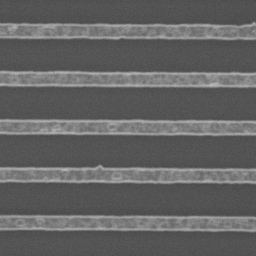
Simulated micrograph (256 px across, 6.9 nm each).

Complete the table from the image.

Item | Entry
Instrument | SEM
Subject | parallel lines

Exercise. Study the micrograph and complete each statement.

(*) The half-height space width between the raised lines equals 0.241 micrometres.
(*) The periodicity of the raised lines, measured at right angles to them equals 331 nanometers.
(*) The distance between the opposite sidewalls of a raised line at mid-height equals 94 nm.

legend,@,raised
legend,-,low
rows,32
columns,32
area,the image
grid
--------------------------------
--------------------------------
--------------------------------
@@@@@@@@@@@@@@@@@@@@@@@@@@@@@@@@
@@@@@@@@@@@@@@@@@@@@@@@@@@@@@@@@
--------------------------------
--------------------------------
--------------------------------
--------------------------------
@@@@@@@@@@@@@@@@@@@@@@@@@@@@@@@@
@@@@@@@@@@@@@@@@@@@@@@@@@@@@@@@@
--------------------------------
--------------------------------
--------------------------------
--------------------------------
@@@@@@@@@@@@@@@@@@@@@@@@@@@@@@@@
@@@@@@@@@@@@@@@@@@@@@@@@@@@@@@@@
--------------------------------
--------------------------------
--------------------------------
--------------------------------
@@@@@@@@@@@@@@@@@@@@@@@@@@@@@@@@
@@@@@@@@@@@@@@@@@@@@@@@@@@@@@@@@
--------------------------------
--------------------------------
--------------------------------
--------------------------------
@@@@@@@@@@@@@@@@@@@@@@@@@@@@@@@@
@@@@@@@@@@@@@@@@@@@@@@@@@@@@@@@@
--------------------------------
--------------------------------
--------------------------------